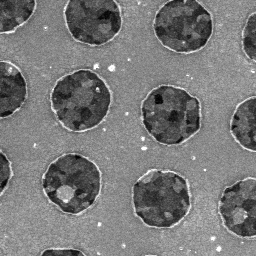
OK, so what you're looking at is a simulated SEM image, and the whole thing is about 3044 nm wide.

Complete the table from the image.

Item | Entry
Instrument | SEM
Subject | raised bodies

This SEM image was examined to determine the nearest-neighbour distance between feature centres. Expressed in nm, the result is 996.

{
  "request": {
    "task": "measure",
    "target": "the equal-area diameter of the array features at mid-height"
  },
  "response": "707 nm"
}